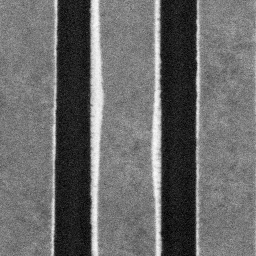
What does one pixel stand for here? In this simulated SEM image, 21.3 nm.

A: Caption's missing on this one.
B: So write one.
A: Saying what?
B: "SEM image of lines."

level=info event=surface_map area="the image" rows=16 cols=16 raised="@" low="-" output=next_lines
@@@@--@@@@--@@@@
@@@@--@@@@--@@@@
@@@---@@@@--@@@@
@@@---@@@@--@@@@
@@@---@@@@--@@@@
@@@---@@@@--@@@@
@@@---@@@@--@@@@
@@@---@@@@--@@@@
@@@---@@@@--@@@@
@@@---@@@@--@@@@
@@@---@@@@--@@@@
@@@---@@@@--@@@@
@@@---@@@@--@@@@
@@@---@@@@--@@@@
@@@---@@@@--@@@@
@@@---@@@@--@@@@